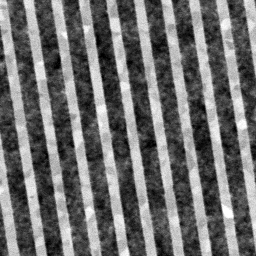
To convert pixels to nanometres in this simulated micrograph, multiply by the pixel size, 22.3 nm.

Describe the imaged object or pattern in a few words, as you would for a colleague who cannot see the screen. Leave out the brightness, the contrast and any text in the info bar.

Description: parallel lines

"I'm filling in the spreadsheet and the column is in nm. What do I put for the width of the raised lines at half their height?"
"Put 198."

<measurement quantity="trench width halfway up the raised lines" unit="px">18.2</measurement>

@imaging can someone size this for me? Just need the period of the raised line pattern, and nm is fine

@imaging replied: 606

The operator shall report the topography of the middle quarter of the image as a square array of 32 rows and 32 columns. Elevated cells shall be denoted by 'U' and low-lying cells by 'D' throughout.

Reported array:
UUDDDDUUUDDDDUUDDDDDUUDDDDDUUDDD
UUDDDDDUUDDDDDUUDDDDUUUDDDDUUDDD
UUDDDDDUUDDDDDUUDDDDDUUDDDDUUUDD
UUDDDDDUUDDDDDUUDDDDDUUDDDDDUUDD
UUDDDDDUUDDDDDUUDDDDDUUDDDDDUUDD
UUUDDDDUUDDDDDUUDDDDDUUDDDDDUUDD
DUUDDDDDUUDDDDUUDDDDDUUDDDDDUUDD
DUUDDDDDUUDDDDDUDDDDDUUUDDDDUUDD
DUUDDDDDUUDDDDDUUDDDDUUUDDDDUUUD
DUUDDDDDUUDDDDDUUDDDDDUUDDDDDUUD
DUUDDDDDUUDDDDDUUDDDDDUUDDDDDUUD
DUUDDDDDUUDDDDDUUDDDDDUUDDDDDUUD
DDUUDDDDUUUDDDDUUDDDDDUUDDDDDUUD
DDUUDDDDDUUDDDDUUUDDDDUUDDDDDUUD
DDUUDDDDDUUDDDDDUUDDDDUUUDDDDUUD
DDUUDDDDDUUDDDDDUUDDDDDUUDDDDDUU
DDUUDDDDDUUDDDDDUUDDDDDUUDDDDDUU
DDUUDDDDDUUDDDDDUUDDDDDUUDDDDDUU
DDUUUDDDDUUUDDDDUUDDDDDUUDDDDDUU
DDDUUDDDDUUUDDDDUUUDDDDUUDDDDDUU
DDDUUDDDDDUUDDDDDUUDDDDDUDDDDDUU
DDDUUDDDDDUUDDDDDUUDDDDDUUDDDDUU
DDDUUDDDDDUUDDDDDUUDDDDDUUDDDDDU
DDDUUDDDDDUUDDDDDUUDDDDDUUDDDDDU
DDDUUUDDDDUUDDDDDUUDDDDDUUDDDDDU
DDDDUUDDDDUUUDDDDUUDDDDDUUDDDDDU
DDDDUUDDDDDUUDDDDDUUDDDDUUDDDDDU
DDDDUUDDDDDUUDDDDDUUDDDDUUUDDDDU
DDDDUUDDDDDUUDDDDDUUDDDDDUUDDDDD
DDDDUUDDDDDUUDDDDDUUDDDDDUUDDDDD
DDDDUUUDDDDUUDDDDDUUDDDDDUUDDDDD
DDDDDUUDDDDUUUDDDDUUDDDDDUUDDDDD